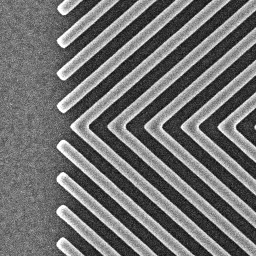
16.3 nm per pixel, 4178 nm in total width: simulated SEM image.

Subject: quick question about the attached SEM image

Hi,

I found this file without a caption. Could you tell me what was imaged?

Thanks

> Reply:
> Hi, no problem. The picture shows groups of lines, slits or small figures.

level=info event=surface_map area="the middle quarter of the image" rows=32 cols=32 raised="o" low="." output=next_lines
oooo.....oooo.....ooooo.....oooo
ooo.....ooooo....ooooo.....oooo.
oo.....oooo.....ooooo....ooooo..
o.....oooo.....oooo.....ooooo...
.....oooo.....oooo.....ooooo....
....oooo.....oooo.....oooo.....o
...oooo.....oooo.....oooo.....oo
.ooooo.....oooo.....oooo.....ooo
oooo.....ooooo.....oooo.....oooo
ooo.....oooo.....ooooo.....oooo.
oo.....oooo.....ooooo.....oooo..
o.....oooo.....ooooo....ooooo...
.....oooo.....oooo.....ooooo....
....oooo.....oooo.....oooo.....o
...oooo.....oooo.....oooo.....oo
..oooo.....oooo.....oooo......oo
..oooo.....ooooo.....oooo.....oo
....oooo.....oooo.....oooo.....o
....ooooo.....oooo.....oooo.....
o.....oooo.....oooo.....oooo....
oo.....oooo.....oooo.....oooo...
ooo.....oooo.....oooo.....ooooo.
oooo.....oooo.....oooo.....oooo.
.oooo.....oooo.....oooo.....oooo
..oooo.....oooo.....oooo.....ooo
...oooo.....oooo.....ooooo.....o
....ooooo....ooooo.....oooo.....
o....ooooo.....oooo.....oooo....
oo.....oooo.....oooo.....oooo...
ooo.....oooo.....oooo.....oooo..
oooo.....oooo.....oooo.....oooo.
.oooo.....oooo.....oooo.....oooo